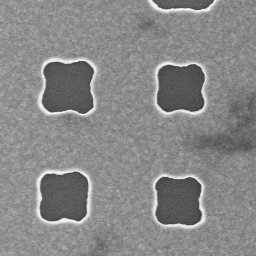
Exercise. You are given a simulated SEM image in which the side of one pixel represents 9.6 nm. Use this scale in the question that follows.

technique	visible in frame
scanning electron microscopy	holes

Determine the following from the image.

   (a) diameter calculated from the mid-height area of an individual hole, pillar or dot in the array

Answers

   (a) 504 nanometers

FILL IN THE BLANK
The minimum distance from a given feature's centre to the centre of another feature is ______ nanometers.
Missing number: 1070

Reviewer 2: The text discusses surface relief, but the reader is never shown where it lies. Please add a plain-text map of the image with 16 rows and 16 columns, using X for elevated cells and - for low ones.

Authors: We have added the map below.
XXXXXXXXXX---XXX
XXXXXXXXXXXXXXXX
XXXXXXXXXXXXXXXX
XXXXXXXXXXXXXXXX
XXX---XXXX---XXX
XXX---XXXX---XXX
XXX---XXXX---XXX
XXXXXXXXXXXXXXXX
XXXXXXXXXXXXXXXX
XXXXXXXXXXXXXXXX
XXXXXXXXXXXXXXXX
XX----XXXX--XXXX
XX---XXXXX---XXX
XXX--XXXXX---XXX
XXXXXXXXXXXXXXXX
XXXXXXXXXXXXXXXX